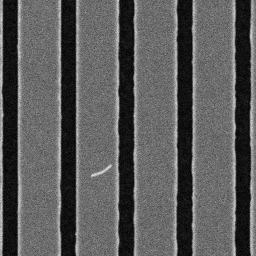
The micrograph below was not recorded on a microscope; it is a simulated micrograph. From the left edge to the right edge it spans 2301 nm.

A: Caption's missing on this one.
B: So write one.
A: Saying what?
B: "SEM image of lines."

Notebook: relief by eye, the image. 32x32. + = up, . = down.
..++++++..+++++..+++++..+++++..+
..++++++..+++++..+++++..+++++..+
..++++++..+++++..+++++..+++++..+
..++++++..+++++..+++++..+++++..+
..++++++..+++++..+++++..+++++..+
..++++++..+++++..+++++..+++++..+
..++++++..+++++..+++++..+++++..+
..++++++..+++++..+++++..+++++..+
..++++++..+++++..+++++..+++++..+
..++++++..+++++..+++++..+++++..+
..++++++..+++++..+++++..+++++..+
..++++++..+++++..+++++..+++++..+
..++++++..+++++..+++++..+++++..+
..++++++..+++++..+++++..+++++..+
..++++++..+++++..+++++..+++++..+
..++++++..+++++..+++++..+++++..+
..++++++..+++++..+++++..+++++..+
..++++++..+++++..+++++..+++++..+
..++++++..+++++..+++++..+++++..+
..++++++..+++++..+++++..+++++..+
..++++++..+++++..+++++..+++++..+
..++++++..+++++..+++++..+++++..+
..++++++..+++++..+++++..+++++..+
..++++++..+++++..+++++..+++++..+
..++++++.++++++..+++++..+++++..+
..++++++..+++++..+++++..+++++..+
..++++++..+++++..+++++..+++++..+
..+++++...+++++..+++++..+++++..+
..++++++..+++++..+++++..+++++..+
..++++++.++++++..+++++..+++++..+
..++++++.++++++..+++++..+++++..+
..++++++.++++++..+++++..+++++..+